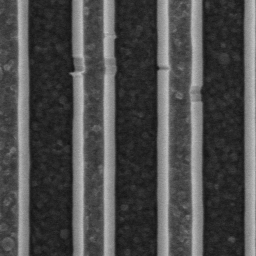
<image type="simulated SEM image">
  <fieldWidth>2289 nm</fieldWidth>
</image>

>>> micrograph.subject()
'one or a few lines or trenches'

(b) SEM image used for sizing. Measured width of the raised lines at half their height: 0.292 microns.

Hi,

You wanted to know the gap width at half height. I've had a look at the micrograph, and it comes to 472 nm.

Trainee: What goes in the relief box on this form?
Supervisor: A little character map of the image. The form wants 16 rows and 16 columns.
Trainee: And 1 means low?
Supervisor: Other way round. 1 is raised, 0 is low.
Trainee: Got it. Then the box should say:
1000011000110000
1000011000110000
1000011000110000
1000011000110000
1000011000110000
1000011000110000
1000011000110000
1000011000110000
1000011000110000
1100011000110000
1100011000110000
1100011000110000
1000011000110000
1000011000110000
1000011000110000
1000011000110000